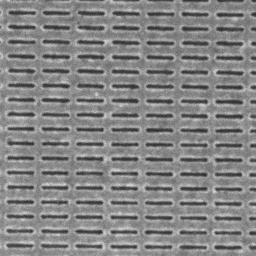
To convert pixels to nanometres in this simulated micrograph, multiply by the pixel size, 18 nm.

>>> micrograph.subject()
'a regular array of holes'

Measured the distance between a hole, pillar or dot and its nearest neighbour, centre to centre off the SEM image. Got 14.4 px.